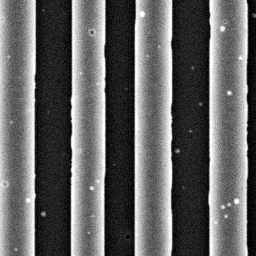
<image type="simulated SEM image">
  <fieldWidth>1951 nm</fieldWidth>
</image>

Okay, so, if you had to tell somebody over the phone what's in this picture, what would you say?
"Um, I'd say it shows lines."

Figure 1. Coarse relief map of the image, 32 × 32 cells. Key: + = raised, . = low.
++++.....++++....++++.....+++++.
++++.....++++....++++.....+++++.
++++.....++++....++++.....+++++.
++++.....++++....++++.....+++++.
++++.....++++....++++.....+++++.
++++.....++++....++++.....+++++.
++++.....++++....++++.....+++++.
++++.....++++....++++.....+++++.
++++.....++++....++++.....+++++.
++++.....++++....++++.....+++++.
++++.....++++....++++.....+++++.
++++.....++++....++++.....+++++.
++++.....++++....++++.....+++++.
++++.....++++....++++.....+++++.
++++.....++++....++++.....+++++.
++++.....++++....++++.....+++++.
++++.....++++....++++.....+++++.
++++.....++++....++++.....+++++.
++++.....++++....++++.....+++++.
++++.....++++....++++.....+++++.
++++.....++++....++++.....+++++.
++++.....++++....++++.....+++++.
++++.....++++....++++.....+++++.
++++.....++++....++++.....+++++.
++++.....++++....++++.....+++++.
++++.....++++....++++.....+++++.
++++.....++++....++++.....+++++.
++++.....++++....++++.....+++++.
++++.....++++....++++.....+++++.
++++.....++++....++++.....+++++.
++++.....++++....++++.....+++++.
++++.....++++....++++.....+++++.